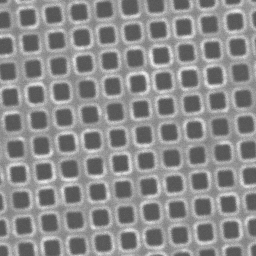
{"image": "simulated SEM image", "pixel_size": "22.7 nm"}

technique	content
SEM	a regular array of holes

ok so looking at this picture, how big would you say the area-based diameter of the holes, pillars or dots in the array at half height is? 442 nm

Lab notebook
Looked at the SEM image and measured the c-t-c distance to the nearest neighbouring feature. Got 579 nm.